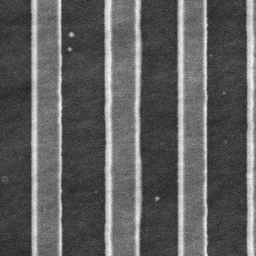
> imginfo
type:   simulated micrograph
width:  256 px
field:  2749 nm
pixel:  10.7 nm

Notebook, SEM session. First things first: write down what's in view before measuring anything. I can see lines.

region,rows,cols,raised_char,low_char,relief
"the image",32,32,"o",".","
....oooo......ooo......ooo.....o
....oooo.....oooo......ooo.....o
....oooo.....oooo......ooo.....o
....oooo.....oooo......ooo.....o
....oooo......ooo......ooo.....o
....oooo......ooo......ooo.....o
....oooo......ooo......ooo.....o
....oooo......ooo......ooo.....o
....oooo......ooo......ooo.....o
....oooo......ooo......ooo.....o
....oooo......ooo......ooo.....o
....oooo......ooo......ooo.....o
....oooo......ooo......ooo.....o
....oooo.....oooo......ooo.....o
....oooo.....oooo......ooo.....o
....oooo......ooo......ooo.....o
....oooo......ooo......ooo.....o
....oooo......ooo......ooo.....o
....oooo......ooo......ooo.....o
....oooo......ooo......ooo.....o
....oooo......ooo......ooo.....o
....oooo......ooo......ooo.....o
....oooo......ooo......ooo.....o
....oooo......ooo......ooo.....o
....oooo......ooo......ooo.....o
....oooo......ooo......ooo.....o
....oooo......ooo......ooo.....o
....oooo......ooo......ooo.....o
....oooo......ooo......ooo.....o
....oooo......ooo......ooo.....o
....oooo......ooo......ooo.....o
....oooo......ooo......ooo.....o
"